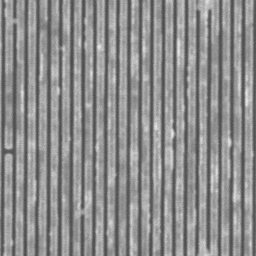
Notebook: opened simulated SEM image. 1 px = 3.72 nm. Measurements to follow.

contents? parallel lines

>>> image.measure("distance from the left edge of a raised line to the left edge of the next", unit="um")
0.0425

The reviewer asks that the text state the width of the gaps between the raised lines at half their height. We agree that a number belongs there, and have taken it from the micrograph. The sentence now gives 0.0186 microns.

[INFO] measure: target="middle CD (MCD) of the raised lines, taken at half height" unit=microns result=0.026